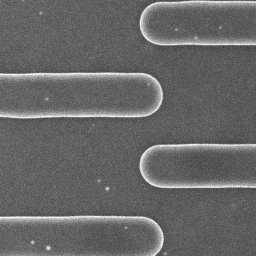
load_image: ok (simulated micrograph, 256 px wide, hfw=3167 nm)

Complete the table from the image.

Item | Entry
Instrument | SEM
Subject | groups of lines, slits or small figures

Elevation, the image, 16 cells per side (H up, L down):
LLLLLLLLLHHHHHHH
LLLLLLLLLHHHHHHH
LLLLLLLLLHHHHHHH
LLLLLLLLLLLLLLLL
LLLLLLLLLLLLLLLL
HHHHHHHHHHLLLLLL
HHHHHHHHHHLLLLLL
LLLLLLLLLLLLLLLL
LLLLLLLLLLLLLLLL
LLLLLLLLLHHHHHHH
LLLLLLLLLHHHHHHH
LLLLLLLLLLHHHHHH
LLLLLLLLLLLLLLLL
LLLLLLLLLLLLLLLL
HHHHHHHHHHLLLLLL
HHHHHHHHHHLLLLLL